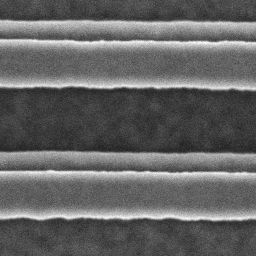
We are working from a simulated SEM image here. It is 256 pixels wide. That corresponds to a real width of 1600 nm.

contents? lines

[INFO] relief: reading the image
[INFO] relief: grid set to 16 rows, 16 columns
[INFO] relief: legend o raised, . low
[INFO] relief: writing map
................
oooooooooooooooo
oooooooooooooooo
oooooooooooooooo
oooooooooooooooo
.............ooo
................
................
................
................
oooooooooooooooo
oooooooooooooooo
oooooooooooooooo
oooooooooooooooo
................
................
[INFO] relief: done